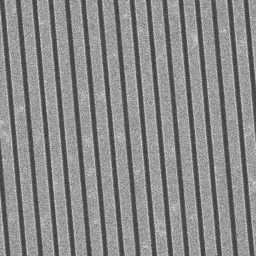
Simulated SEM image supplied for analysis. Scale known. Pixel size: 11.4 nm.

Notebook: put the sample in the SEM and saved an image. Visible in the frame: parallel lines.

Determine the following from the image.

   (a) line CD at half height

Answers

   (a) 128 nanometres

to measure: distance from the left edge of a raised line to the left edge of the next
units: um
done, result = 0.185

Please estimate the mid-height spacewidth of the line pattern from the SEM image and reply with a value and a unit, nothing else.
53.9 nanometres